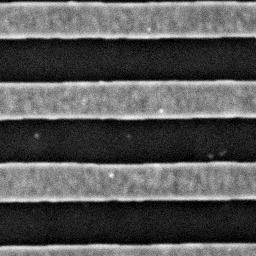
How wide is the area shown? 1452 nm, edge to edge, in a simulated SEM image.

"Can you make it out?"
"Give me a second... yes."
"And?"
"lines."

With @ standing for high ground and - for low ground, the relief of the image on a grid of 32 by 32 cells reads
@@@@@@@@@@@@@@@@@@@@@@@@@@@@@@@@
@@@@@@@@@@@@@@@@@@@@@@@@@@@@@@@@
@@@@@@@@@@@@@@@@@@@@@@@@@@@@@@@@
@@@@@@@@@@@@@@@@@@@@@@@@@@@@@@@@
@@@@@@@@@@@@@@@@@@@@@@@@@@@@@@@@
--------------------------------
--------------------------------
--------------------------------
--------------------------------
--------------------------------
@@@@@@@@@@@@@@@@@@@@@@@@@@@@@@@@
@@@@@@@@@@@@@@@@@@@@@@@@@@@@@@@@
@@@@@@@@@@@@@@@@@@@@@@@@@@@@@@@@
@@@@@@@@@@@@@@@@@@@@@@@@@@@@@@@@
@@@@@@@@@@@@@@@@@@@@@@@@@@@@@@@@
--------------------------------
--------------------------------
--------------------------------
--------------------------------
--------------------------------
@@@@@@@@@@------------@@@@@@@@@@
@@@@@@@@@@@@@@@@@@@@@@@@@@@@@@@@
@@@@@@@@@@@@@@@@@@@@@@@@@@@@@@@@
@@@@@@@@@@@@@@@@@@@@@@@@@@@@@@@@
@@@@@@@@@@@@@@@@@@@@@@@@@@@@@@@@
--------------------------------
--------------------------------
--------------------------------
--------------------------------
--------------------------------
--------------------------------
@@@@@@@@@@@@@@@@@@@@@@@@@@@@@@@@